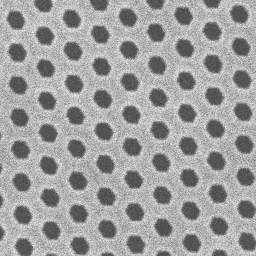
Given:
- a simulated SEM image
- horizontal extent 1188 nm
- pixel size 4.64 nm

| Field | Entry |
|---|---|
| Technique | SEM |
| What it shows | a regular array of holes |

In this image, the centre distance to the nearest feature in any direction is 32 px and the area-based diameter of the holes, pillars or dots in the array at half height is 86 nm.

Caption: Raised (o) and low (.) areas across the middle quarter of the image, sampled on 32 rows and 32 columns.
ooooooo.....ooooooooo.....oooooo
oooooooo....oooooooooo...ooooooo
oooooooo...oooo..ooooo...oooo...
o...oooooooooo....oooooooooo....
.....ooooooooo.....ooooooooo....
o....oooooooooo....oooooooooo...
o....ooo..ooooo...oooo...ooooo..
oooooooo...oooooooooo....ooooooo
ooooooo.....ooooooooo.....oooooo
oooooooo....oooooooooo....oooooo
oooooooo....oooo.oooooo..oooo...
o...ooooooooooo....oooooooooo...
o....ooooooooo.....oooooooooo...
o....oooooooooo....oooooooooo...
o....oooo.oooooo...ooo...ooooo..
oooooooo....oooooooooo....oooooo
oooooooo....oooooooooo....oooooo
oooooooo....oooooooooo....oooooo
ooooooooo...oooo.oooooo...ooo...
o...ooooooooooo....oooooooooo...
o....oooooooooo....oooooooooo...
o....oooooooooo....oooooooooo...
oo...ooooooooooo...oooo..ooooo..
ooo.oooo....oooooooooo....oooooo
oooooooo....oooooooooo.....ooooo
oooooooo.....ooooooooo.....ooooo
ooooooooo...oooo.oooooo...oooo..
oo...ooooooooooo...oooooooooo...
o....oooooooooo.....ooooooooo...
o.....ooooooooo.....ooooooooo...
oo....oooooooooo...oooo..ooooo..
ooo..oooo...ooooooooooo...oooooo